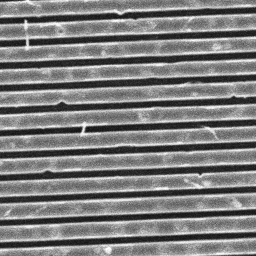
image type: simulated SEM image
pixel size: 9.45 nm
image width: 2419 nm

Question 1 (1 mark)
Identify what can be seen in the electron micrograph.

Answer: parallel lines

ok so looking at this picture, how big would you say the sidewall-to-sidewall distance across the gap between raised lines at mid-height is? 64.9 nm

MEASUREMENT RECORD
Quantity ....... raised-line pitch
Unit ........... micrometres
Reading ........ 0.212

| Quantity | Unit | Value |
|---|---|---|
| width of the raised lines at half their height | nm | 147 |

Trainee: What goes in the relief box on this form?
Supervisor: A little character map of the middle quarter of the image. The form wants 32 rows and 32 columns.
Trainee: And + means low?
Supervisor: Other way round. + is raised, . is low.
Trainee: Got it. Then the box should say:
..........++++++++++++++++++++++
++++++++++++++++++++++++++++++++
++++++++++++++++++++++++++++++++
+++++++++++++++++++++...........
................................
.........................+++++++
.+++++++++++++++++++++++++++++++
++++++++++++++++++++++++++++++++
++++++++++++++++++++++++++++++++
++++++++++++....................
................................
...........++++.++++++++++++++++
++++++++++++++++++++++++++++++++
++++++++++++++++++++++++++++++++
+++++++++++++++++++++++++++.....
+++.++..........................
..........................++++++
..++++++++++++++++++++++++++++++
++++++++++++++++++++++++++++++++
++++++++++++++++++++++++++++++++
+++++++++++++...++..............
................................
.................+++++++++++++++
++++++++++++++++++++++++++++++++
++++++++++++++++++++++++++++++++
++++++++++++++++++++++++++++++++
++++..++........................
................................
........++++++++++++++++++++++++
++++++++++++++++++++++++++++++++
++++++++++++++++++++++++++++++++
++++++++++++++++++++++++........